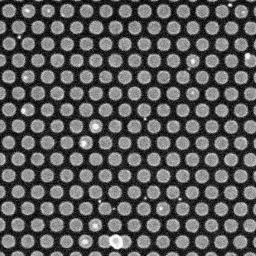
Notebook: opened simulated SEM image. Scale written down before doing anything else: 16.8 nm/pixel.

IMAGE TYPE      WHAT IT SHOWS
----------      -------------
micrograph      a regular array of raised bodies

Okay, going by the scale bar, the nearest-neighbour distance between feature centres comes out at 0.318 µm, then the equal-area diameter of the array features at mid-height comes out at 205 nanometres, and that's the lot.